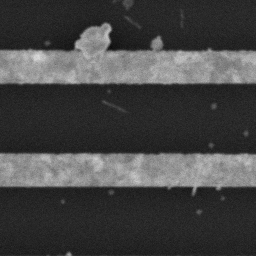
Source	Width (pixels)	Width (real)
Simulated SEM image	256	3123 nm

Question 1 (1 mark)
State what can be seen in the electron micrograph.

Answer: lines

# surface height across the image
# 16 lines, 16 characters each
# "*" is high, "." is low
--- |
................
................
.....**.........
****************
****************
................
................
................
................
................
****************
****************
................
................
................
................